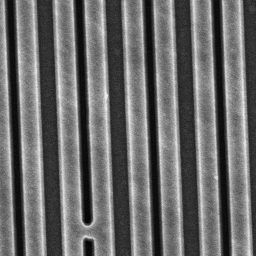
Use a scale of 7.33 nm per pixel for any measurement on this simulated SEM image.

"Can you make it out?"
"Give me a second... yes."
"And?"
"parallel lines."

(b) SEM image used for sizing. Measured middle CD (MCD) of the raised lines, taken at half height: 0.149 micrometres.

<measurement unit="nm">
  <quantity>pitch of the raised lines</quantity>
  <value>252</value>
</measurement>